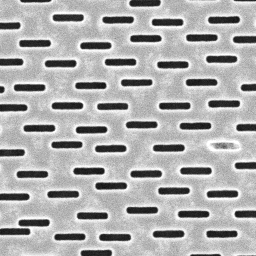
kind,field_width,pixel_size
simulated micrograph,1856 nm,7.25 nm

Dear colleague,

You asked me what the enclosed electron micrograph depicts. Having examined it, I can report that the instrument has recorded a regular array of holes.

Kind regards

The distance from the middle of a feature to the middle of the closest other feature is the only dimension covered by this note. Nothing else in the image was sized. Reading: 30.7 px